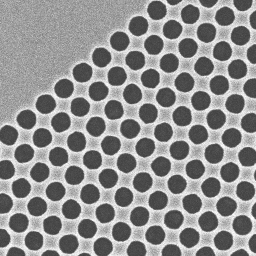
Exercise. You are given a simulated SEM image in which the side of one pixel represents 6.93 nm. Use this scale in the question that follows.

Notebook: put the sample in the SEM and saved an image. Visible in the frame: a regular array of holes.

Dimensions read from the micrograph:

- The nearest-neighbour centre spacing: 166 nanometres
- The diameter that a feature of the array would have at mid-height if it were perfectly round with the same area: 135 nanometres